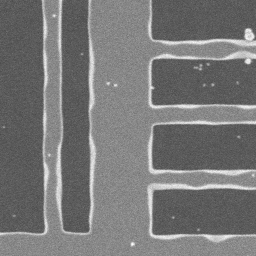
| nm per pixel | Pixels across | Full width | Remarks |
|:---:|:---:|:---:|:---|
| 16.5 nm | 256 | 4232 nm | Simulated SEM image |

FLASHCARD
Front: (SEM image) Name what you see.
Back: groups of lines, slits or small figures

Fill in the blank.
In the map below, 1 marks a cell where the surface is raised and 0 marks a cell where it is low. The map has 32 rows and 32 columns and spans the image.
00000111000111111110000000000000
00000111000111111110000000000000
00000011000111111110000000000000
00000011000111111110000000000000
00000011000111111110000000000000
00000011000111111111111111111111
00000011000111111111111111111111
00000011000111111110000000000000
00000011000111111110000000000000
00000011000111111110000000000000
00000011000111111110000000000000
00000011000111111110000000000000
00000011000111111110000000000000
00000011000111111111111111111111
00000011000111111111111111111111
00000011000111111111100000110000
00000011000111111110000000000000
00000111000111111110000000000000
00000111000111111110000000000000
00000110000011111110000000000000
00000010000111111110000000000000
00000010000111111111111111110011
00000010000111111111111111111111
00000010000111111110000010000011
00000010000111111110000000000000
00000010000111111110000000000000
00000011000111111110000000000000
00000011000111111110000000000000
00000011000111111110000000000000
11111111111111111111001111001111
11111111111111111111111111111111
11111111111111111111111111111111